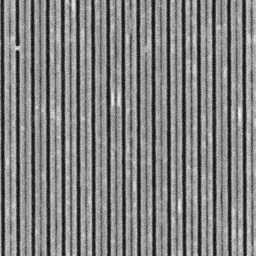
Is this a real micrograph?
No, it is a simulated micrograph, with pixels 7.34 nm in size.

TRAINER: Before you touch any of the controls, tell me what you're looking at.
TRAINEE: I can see parallel lines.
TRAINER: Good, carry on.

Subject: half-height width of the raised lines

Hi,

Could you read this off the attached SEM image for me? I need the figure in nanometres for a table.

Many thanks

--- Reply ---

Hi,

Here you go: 31.2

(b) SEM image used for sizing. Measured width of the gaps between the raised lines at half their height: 31.2 nm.